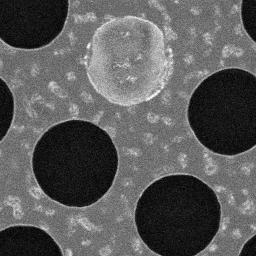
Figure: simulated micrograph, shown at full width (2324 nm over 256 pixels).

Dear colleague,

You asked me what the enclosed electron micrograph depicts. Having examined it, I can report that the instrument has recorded holes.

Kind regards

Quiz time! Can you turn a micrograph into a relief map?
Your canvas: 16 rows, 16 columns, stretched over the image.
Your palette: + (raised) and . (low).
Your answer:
....+++++++++++.
....+++++++++++.
...+++++++++++++
++++++++++++++++
++++++++++++++..
.+++++++++++....
.+++++++++++....
.+++++++++++....
+++....+++++....
++.....++++++..+
++.....+++++++++
++.....++....+++
+++...+++.....++
++++++++......++
...++++++.....++
....+++++....++.